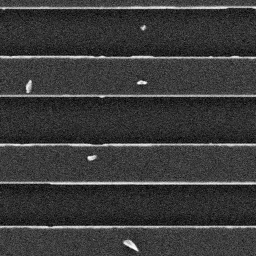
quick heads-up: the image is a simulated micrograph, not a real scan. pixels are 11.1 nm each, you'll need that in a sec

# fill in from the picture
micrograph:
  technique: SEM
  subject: lines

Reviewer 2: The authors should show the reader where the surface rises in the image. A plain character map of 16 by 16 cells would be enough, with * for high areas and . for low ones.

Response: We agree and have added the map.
**************.*
................
................
................
****************
****************
................
................
................
****************
****************
................
................
................
****************
****************